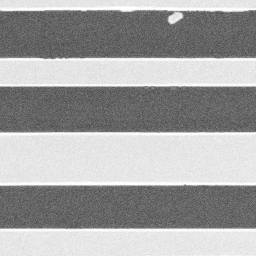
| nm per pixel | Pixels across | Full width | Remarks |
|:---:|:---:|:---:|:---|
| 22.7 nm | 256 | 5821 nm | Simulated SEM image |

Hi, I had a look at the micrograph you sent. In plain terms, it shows lines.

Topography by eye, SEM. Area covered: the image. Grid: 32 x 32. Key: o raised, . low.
oooooooooooooooooooooooooooooooo
................................
................................
................................
................................
................................
................................
oooooooooooooooooooooooooooooooo
oooooooooooooooooooooooooooooooo
oooooooooooooooooooooooooooooooo
oooooooooooooooooooooooooooooooo
................................
................................
................................
................................
................................
................................
oooooooooooooooooooooooooooooooo
oooooooooooooooooooooooooooooooo
oooooooooooooooooooooooooooooooo
oooooooooooooooooooooooooooooooo
oooooooooooooooooooooooooooooooo
oooooooooooooooooooooooooooooooo
................................
................................
................................
................................
................................
................................
oooooooooooooooooooooooooooooooo
oooooooooooooooooooooooooooooooo
oooooooooooooooooooooooooooooooo